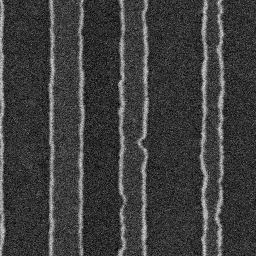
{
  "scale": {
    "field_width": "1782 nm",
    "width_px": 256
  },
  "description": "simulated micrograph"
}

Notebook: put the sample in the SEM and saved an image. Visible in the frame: one or a few lines or trenches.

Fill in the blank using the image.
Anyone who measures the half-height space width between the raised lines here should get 343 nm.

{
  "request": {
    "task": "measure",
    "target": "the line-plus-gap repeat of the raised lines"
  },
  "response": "508 nanometres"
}